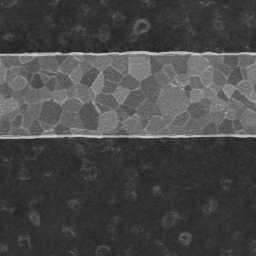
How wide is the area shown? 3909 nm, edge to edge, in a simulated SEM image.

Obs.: one or a few lines or trenches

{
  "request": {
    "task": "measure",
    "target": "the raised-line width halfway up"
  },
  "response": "1.26 µm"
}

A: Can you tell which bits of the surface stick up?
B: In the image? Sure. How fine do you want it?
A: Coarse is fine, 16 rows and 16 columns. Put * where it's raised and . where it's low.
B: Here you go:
................
................
................
****************
****************
****************
****************
****************
***..*******....
................
................
................
................
................
................
................